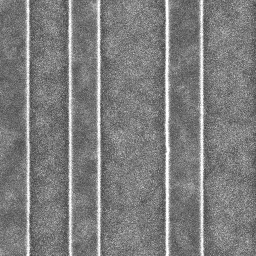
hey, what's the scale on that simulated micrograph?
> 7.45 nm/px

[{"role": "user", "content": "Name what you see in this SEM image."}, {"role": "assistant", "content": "one or a few lines or trenches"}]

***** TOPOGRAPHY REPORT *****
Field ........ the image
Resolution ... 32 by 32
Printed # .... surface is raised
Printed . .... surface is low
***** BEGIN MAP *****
###......###.........####.......
###......###.........####.......
###......###.........####.......
###......###.........####.......
###......###.........####.......
####.....###.........####.......
####.....###.........####.......
####.....###.........####.......
####.....###.........####.......
####.....###.........####.......
####.....###.........####.......
####.....###.........####.......
####.....###.........####.......
####.....###.........####.......
####.....###.........####.......
####.....###.........####.......
####.....###.........####.......
####.....###.........####.......
####.....###.........####.......
####.....###.........####.......
####.....###.........####.......
####.....###.........####.......
####.....###.........####.......
####.....###.........####.......
####.....###.........####.......
####.....###.........####.......
####.....###.........####.......
####.....###.........####.......
####.....###.........####.......
####.....###.........####.......
####.....###.........####.......
####.....###.........####.......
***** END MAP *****